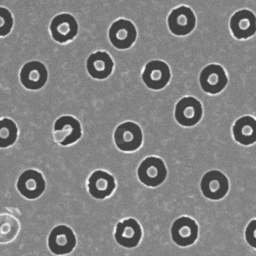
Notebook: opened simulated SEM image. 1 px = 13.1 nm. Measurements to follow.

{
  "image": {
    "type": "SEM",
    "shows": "a regular array of ring-shaped grooves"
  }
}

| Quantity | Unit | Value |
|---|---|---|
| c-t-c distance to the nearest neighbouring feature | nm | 690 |